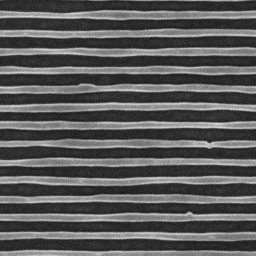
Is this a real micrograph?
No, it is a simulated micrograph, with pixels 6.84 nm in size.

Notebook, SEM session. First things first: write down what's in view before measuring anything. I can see parallel lines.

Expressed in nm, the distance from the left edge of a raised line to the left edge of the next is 126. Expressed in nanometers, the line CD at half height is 46.1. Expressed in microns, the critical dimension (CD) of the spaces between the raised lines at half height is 0.0795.